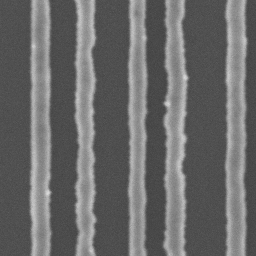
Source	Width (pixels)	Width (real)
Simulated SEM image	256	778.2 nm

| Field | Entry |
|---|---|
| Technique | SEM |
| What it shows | lines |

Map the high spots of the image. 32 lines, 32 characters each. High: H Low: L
LLLLHHLLLLHHLLLLHHLLLHHLLLLLHHHL
LLLLHHLLLLHHLLLLHHLLLHHLLLLLHHHL
LLLLHHLLLLHHLLLLHHLLLHHLLLLLHHHL
LLLLHHLLLLHHLLLLHHLLLHHLLLLLHHHL
LLLLHHLLLLHHLLLLHHLLLHHLLLLLHHHL
LLLLHHLLLLHHLLLLHHLLLHHLLLLLLHHL
LLLLHHLLLLHLLLLLHHLLLHHLLLLLHHHL
LLLLHHLLLLHHLLLLHHLLLHHLLLLLHHHL
LLLLHHLLLLHHLLLLHHLLLHHLLLLLHHHL
LLLLHHLLLLHHLLLLHHLLLHHLLLLLHHHL
LLLLHHLLLLHHLLLLHHLLLHHLLLLLHHHL
LLLLHHLLLLHHLLLLHHLLLHHLLLLLHHHL
LLLLHHLLLLHHLLLLHHLLLHHLLLLLHHHL
LLLLHHLLLLHHLLLLHHLLLHHLLLLLHHHL
LLLLHHLLLLHHLLLLHHLLLHHLLLLLHHHL
LLLLHHLLLLHHLLLLHHLLLHHLLLLLHHHL
LLLLHHLLLLHHLLLLHHLLLHHLLLLLHHHL
LLLLHHLLLLHHLLLLHHLLLHHLLLLLHHHL
LLLLHHLLLLHLLLLLHHLLLHHLLLLLHHHL
LLLLHHLLLLHHLLLLHHLLLHHLLLLLHHHL
LLLLHHLLLLHHLLLLHHLLLHHLLLLLHHHL
LLLLHHLLLLHHLLLLHHLLLHHLLLLLHHHL
LLLLHHLLLLHHLLLLHHLLLHHLLLLLHHLL
LLLLHHLLLLHHLLLLHHLLLHHLLLLLHHHL
LLLLHHLLLLHHLLLLHHLLLHHLLLLLHHHL
LLLLHHLLLLHHLLLLHHLLLHHLLLLLHHHL
LLLLHHLLLLHHLLLLHHLLLHHLLLLLHHHL
LLLLHHLLLLHHLLLLHHLLLHHLLLLLHHHL
LLLLHHLLLLHHLLLLHHLLLHHLLLLLHHHL
LLLLHHLLLLHHLLLLHHLLLHHLLLLLHHHL
LLLLHHLLLLHHLLLLHHLLLHHLLLLLHHHL
LLLLHHLLLLHHLLLLHHLLLHHLLLLLHHHL